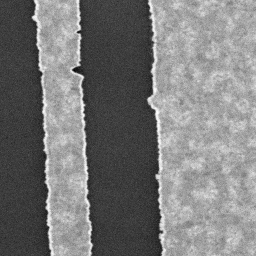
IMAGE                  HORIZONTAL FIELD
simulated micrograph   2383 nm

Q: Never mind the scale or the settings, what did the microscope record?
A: one or a few lines or trenches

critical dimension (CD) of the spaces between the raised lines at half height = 676 nanometres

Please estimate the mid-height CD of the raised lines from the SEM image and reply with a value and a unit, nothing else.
372 nm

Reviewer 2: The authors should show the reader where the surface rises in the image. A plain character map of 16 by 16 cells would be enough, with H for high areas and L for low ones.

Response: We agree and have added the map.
LLHHHLLLLHHHHHHH
LLHHHLLLLLHHHHHH
LLHHHLLLLLHHHHHH
LLHHHLLLLLHHHHHH
LLLHHLLLLLHHHHHH
LLLHHLLLLLHHHHHH
LLLHHLLLLHHHHHHH
LLLHHLLLLLHHHHHH
LLLHHLLLLLHHHHHH
LLLHHLLLLLHHHHHH
LLLHHLLLLLHHHHHH
LLLHHLLLLLHHHHHH
LLLHHLLLLLHHHHHH
LLLHHHLLLLHHHHHH
LLLHHHLLLLHHHHHH
LLLHHHLLLLHHHHHH